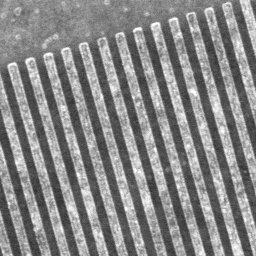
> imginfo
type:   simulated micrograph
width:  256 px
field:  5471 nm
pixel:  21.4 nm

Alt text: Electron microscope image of parallel lines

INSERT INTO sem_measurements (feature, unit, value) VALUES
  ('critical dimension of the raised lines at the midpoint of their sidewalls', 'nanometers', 180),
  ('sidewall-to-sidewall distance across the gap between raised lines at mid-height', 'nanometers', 216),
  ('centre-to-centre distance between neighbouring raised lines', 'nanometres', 396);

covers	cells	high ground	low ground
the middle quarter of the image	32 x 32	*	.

**...**...**...**...**...**...*.
.**...**..***..**...**...**...**
.**...**...**...**..**...**...**
.**...**...**...**...**..***..**
..**..**...**...**...**...**..**
..**...**...**..***..**...**...*
..**...**...**...**..***..**...*
..**...**...**...**...**...**..*
...**..***..***..**...**...**...
...**...**...**..***..**...**...
*..**...**...**...**...**..**...
*...**..**...**...**...**...**..
*...**...**...**..**...**...**..
*...**...**...**...**..***..**..
**..**...**...**...**...**..***.
**...**...**..***..**...**...**.
**...**...**...**..***..**...**.
**...**...**...**...**...**..**.
.**...**..**...**...**...**...**
.**...**...**..***..**...**...**
.**...**...**...**...**..***..**
.***..**...**...**...**...**..**
..**...**...*...**...**...**...*
..**...**...**...**..***..**...*
..**...**...**...**...**..***..*
...**..***..**...**...**...**...
...**...**...**..***..**...**...
...**...**...**...**...**..**...
*...**..**...**...**...**...**..
*...**..***...*...**...**...**..
*...**...**...**...**..***..**..
**..**...**...**...**...**..***.